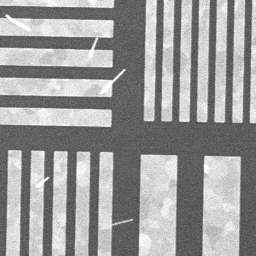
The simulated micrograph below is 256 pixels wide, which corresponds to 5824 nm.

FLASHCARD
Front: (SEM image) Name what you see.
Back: groups of lines, slits or small figures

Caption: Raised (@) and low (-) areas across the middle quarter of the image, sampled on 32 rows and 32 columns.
----@@@@@@@@--------@@@--@@--@@@
--------------------@@@--@@--@@-
--------------------@@@--@@--@@-
--------------------@@@--@@--@@-
@@@@@@@@@@@@--------@@@--@@--@@-
@@@@@@@@@@@@--------@@@--@@--@@-
@@@@@@@@@@@@--------@@@--@@--@@-
@@@@@@@@@@@@--------@@@--@@--@@-
--------------------@@@--@@--@@-
--------------------@@---@@--@@-
--------------------@@---@@--@@-
@@@@@@@@------------@@---@@--@@-
@@@@@@@@@@@@--------@@---@@--@@-
@@@@@@@@@@@@--------@@---@@--@@-
@@@@@@@@@@@@--------------------
---------@@@--------------------
--------------------------------
--------------------------------
--------------------------------
--------------------------------
--------------------------------
--------------------------------
@--@@@---@@@--------------------
@--@@@---@@@-------@@@@@@@@@----
@--@@@---@@@-------@@@@@@@@@----
@--@@@---@@@-------@@@@@@@@@----
@--@@@---@@@-------@@@@@@@@@----
@--@@@---@@@-------@@@@@@@@@----
@--@@@---@@@-------@@@@@@@@@----
---@@@---@@@-------@@@@@@@@@----
---@@@---@@@-------@@@@@@@@@----
---@@@---@@@-------@@@@@@@@@----